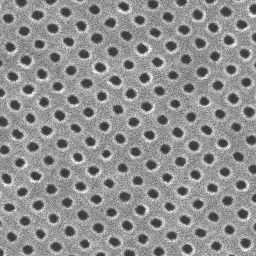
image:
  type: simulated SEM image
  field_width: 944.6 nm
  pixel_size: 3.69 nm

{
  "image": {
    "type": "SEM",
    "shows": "a regular array of holes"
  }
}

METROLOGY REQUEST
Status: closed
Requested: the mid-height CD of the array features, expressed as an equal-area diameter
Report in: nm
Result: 36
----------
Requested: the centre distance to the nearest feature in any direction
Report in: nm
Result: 74.3